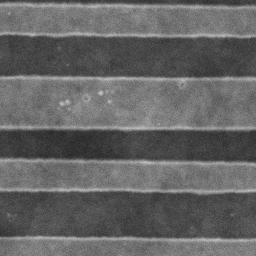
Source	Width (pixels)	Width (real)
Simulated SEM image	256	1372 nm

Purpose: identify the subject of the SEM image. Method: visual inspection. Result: lines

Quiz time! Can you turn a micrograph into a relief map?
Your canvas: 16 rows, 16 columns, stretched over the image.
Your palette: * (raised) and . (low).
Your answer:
****************
****************
................
................
................
****************
****************
****************
................
................
****************
****************
................
................
................
****************